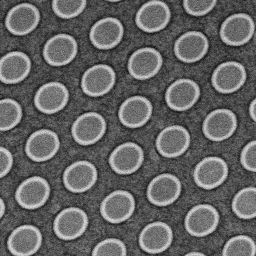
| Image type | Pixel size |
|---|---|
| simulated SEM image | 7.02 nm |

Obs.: a regular array of raised bodies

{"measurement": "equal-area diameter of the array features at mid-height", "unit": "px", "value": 30.8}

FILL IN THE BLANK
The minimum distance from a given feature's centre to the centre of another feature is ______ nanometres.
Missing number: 338